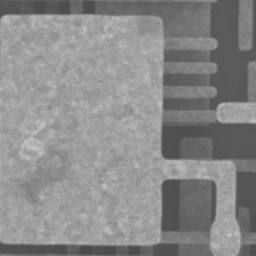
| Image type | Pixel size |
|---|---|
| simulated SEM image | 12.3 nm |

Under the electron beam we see wiring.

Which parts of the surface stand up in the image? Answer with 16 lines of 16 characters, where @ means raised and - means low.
----------------
@@@@@@@@@@------
@@@@@@@@@@------
@@@@@@@@@@------
@@@@@@@@@@------
@@@@@@@@@@------
@@@@@@@@@@----@@
@@@@@@@@@@----@@
@@@@@@@@@@------
@@@@@@@@@@------
@@@@@@@@@@@@@@@-
@@@@@@@@@@---@@-
@@@@@@@@@@----@-
@@@@@@@@@@---@@-
@@@@@@@@@@---@@-
-------------@@-